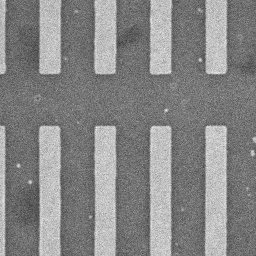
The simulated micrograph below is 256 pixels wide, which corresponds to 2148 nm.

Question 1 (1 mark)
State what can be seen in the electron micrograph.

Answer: groups of lines, slits or small figures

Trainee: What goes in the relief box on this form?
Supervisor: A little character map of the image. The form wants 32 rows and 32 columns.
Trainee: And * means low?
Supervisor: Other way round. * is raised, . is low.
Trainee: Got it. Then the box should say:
*....***....**.....**.....**....
*....***....**.....**.....**....
*....**.....**.....**.....**....
.....**.....**.....**.....**....
.....**.....**.....**.....**....
.....**.....**.....**.....**....
*....**.....**.....**.....**....
*....**.....**.....**.....**....
*....**.....**.....**.....**....
................................
................................
................................
................................
................................
................................
................................
.....**.....**.....**.....**....
.....**.....**.....**.....**....
.....**.....**.....**.....**....
.....**.....**.....**.....**....
.....**.....**.....**.....**....
.....**.....**.....**.....**....
.....**.....**.....**.....**....
.....**.....**.....**.....**....
.....**.....**.....**.....**....
.....**.....**.....**.....**....
.....**.....**.....**.....**....
.....**.....**.....**.....**....
.....**.....**.....**.....**....
.....**.....**.....**.....**....
.....**.....**.....**.....**....
.....**.....**.....**.....**....